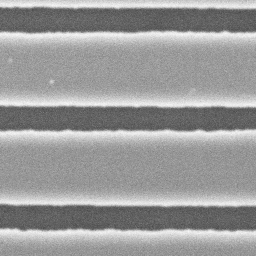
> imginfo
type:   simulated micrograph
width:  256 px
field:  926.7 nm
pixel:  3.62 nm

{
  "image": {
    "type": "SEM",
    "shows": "lines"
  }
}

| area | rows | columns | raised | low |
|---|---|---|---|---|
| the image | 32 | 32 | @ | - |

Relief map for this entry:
@@@@@@@@@@@@@@@@@@@@@@@@@@@@@@@@
--------------------------------
--------------------------------
--------------------------------
@@@@@@@@@@@@@@@@@@@@@@@@@@@@@@@@
@@@@@@@@@@@@@@@@@@@@@@@@@@@@@@@@
@@@@@@@@@@@@@@@@@@@@@@@@@@@@@@@@
@@@@@@@@@@@@@@@@@@@@@@@@@@@@@@@@
@@@@@@@@@@@@@@@@@@@@@@@@@@@@@@@@
@@@@@@@@@@@@@@@@@@@@@@@@@@@@@@@@
@@@@@@@@@@@@@@@@@@@@@@@@@@@@@@@@
@@@@@@@@@@@@@@@@@@@@@@@@@@@@@@@@
@@@@@@@@@@@@@@@@@@@@@@@@@@@@@@@@
--------------------------------
--------------------------------
--------------------------------
@@@@@@@@@@-@@@@@@@@@@@--@@-@@@@@
@@@@@@@@@@@@@@@@@@@@@@@@@@@@@@@@
@@@@@@@@@@@@@@@@@@@@@@@@@@@@@@@@
@@@@@@@@@@@@@@@@@@@@@@@@@@@@@@@@
@@@@@@@@@@@@@@@@@@@@@@@@@@@@@@@@
@@@@@@@@@@@@@@@@@@@@@@@@@@@@@@@@
@@@@@@@@@@@@@@@@@@@@@@@@@@@@@@@@
@@@@@@@@@@@@@@@@@@@@@@@@@@@@@@@@
@@@@@@@@@@@@@@@@@@@@@@@@@@@@@@@@
-@@@@@@@@@@@@@@@@@@@@@@@@@@@@@@@
--------------------------------
--------------------------------
--------------------------------
@@@@@@@@@@@@@@@@@@@@@@@@@@@@@@@@
@@@@@@@@@@@@@@@@@@@@@@@@@@@@@@@@
@@@@@@@@@@@@@@@@@@@@@@@@@@@@@@@@